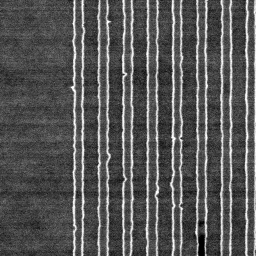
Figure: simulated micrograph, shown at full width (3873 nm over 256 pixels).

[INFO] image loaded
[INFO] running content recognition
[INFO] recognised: parallel lines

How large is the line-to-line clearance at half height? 240 nanometres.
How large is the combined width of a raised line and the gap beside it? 0.373 um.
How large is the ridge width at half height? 138 nm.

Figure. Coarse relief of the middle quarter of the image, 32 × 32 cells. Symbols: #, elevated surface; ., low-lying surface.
...##....##....##....##....##...
...##....##....##....##....##...
...#.....##....##....##....##...
...##....##....##....##....##...
...##....##....##....##....##...
..###....##....##....##....##...
..###....##....##....##....##...
...##....##....##....##....##...
...##....##....##....##....##...
...##....##....##....##....##...
...#.....##....##....##....##...
...##....##....##....##....##...
...##....##....##....##....##...
...##....##....##....##....##...
...##....##....##....##....##...
...##....##....##....##....##...
...##....##....##....##....##...
...##....##....##....##....##...
...##....##....##....##....##...
...##....##....##....##....##...
...##....##....##....##....##...
...##....##....##....##....##...
..###....##....##....##....##...
..###....##....##....##....##...
...##....##....##....##....##...
...##....##....##....##....##...
..###....##....##....##....##...
..###....##....##....##....##...
..###....##....##....##....##...
...##....##....##....##....##...
...##....##....##....##....##...
...##....##....##....###...##...